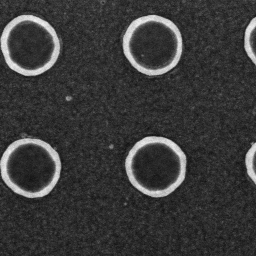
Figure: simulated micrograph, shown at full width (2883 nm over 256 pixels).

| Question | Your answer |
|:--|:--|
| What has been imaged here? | raised bodies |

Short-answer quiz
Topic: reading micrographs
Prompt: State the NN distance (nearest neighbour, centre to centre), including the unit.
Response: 122 pixels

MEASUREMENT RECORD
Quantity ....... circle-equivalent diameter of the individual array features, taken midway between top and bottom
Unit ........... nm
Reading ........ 616